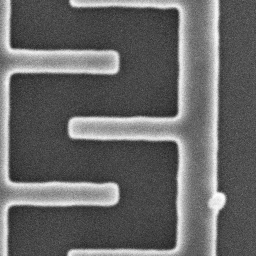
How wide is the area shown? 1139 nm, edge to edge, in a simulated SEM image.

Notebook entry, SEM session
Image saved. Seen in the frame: groups of lines, slits or small figures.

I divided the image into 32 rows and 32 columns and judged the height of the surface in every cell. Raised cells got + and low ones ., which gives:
+........++++++++++++++++++.....
+.....................+++++.....
+......................++++.....
+......................++++.....
+......................++++.....
+......................++++.....
++++++++++++++........+++++.....
+++++++++++++++........++++.....
+++++++++++++++........++++.....
+.....................+++++.....
+.....................+++++.....
+.....................+++++.....
+.....................+++++.....
+.....................+++++.....
+.....................+++++.....
+........++++++++++++++++++.....
+........++++++++++++++++++.....
+.....................+++++.....
+.....................+++++.....
+.....................+++++.....
+.....................+++++.....
+.....................+++++.....
+.....................+++++.....
+++++++++++++++.......+++++.....
+++++++++++++++.......++++++....
++.+++++++.+++........++++++....
+.....................+++++.....
+.....................+++++.....
+.....................+++++.....
+.....................+++++.....
+.....................+++++.....
+........++++++++++++++++++.....